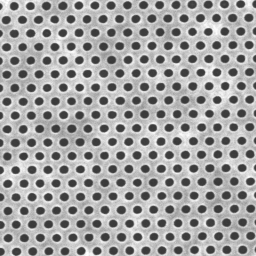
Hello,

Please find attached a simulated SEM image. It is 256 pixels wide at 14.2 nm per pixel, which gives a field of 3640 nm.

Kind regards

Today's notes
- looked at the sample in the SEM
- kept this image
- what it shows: a regular array of holes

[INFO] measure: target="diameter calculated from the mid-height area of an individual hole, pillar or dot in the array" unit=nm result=125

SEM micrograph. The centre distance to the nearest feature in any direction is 222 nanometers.